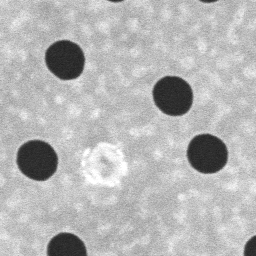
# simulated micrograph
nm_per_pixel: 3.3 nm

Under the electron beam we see holes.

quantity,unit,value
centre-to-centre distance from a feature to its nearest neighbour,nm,282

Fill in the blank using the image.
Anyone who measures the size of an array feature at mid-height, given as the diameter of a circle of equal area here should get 134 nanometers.